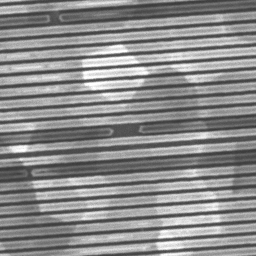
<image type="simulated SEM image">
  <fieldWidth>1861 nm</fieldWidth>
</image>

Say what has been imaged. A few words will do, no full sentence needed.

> parallel lines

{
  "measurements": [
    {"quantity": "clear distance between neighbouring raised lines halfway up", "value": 35.4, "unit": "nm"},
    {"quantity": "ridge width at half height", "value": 49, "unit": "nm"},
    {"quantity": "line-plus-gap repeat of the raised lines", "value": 85.5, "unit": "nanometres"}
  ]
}